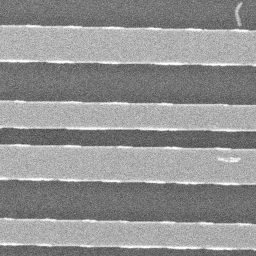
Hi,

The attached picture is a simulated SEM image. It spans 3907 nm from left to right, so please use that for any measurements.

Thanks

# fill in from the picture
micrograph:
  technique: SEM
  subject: lines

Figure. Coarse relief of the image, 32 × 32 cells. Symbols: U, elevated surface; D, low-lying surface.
DDDDDDDDDDDDDDDDDDDDDDDDDDDDDDDD
DDDDDDDDDDDDDDDDDDDDDDDDDDDDDDDD
DDDDDDDDDDDDDDDDDDDDDDDDDDDDDDDD
UUUUUUUUUUUUUUUDDDDDDDDDDDDDDDDD
UUUUUUUUUUUUUUUUUUUUUUUUUUUUUUUU
UUUUUUUUUUUUUUUUUUUUUUUUUUUUUUUU
UUUUUUUUUUUUUUUUUUUUUUUUUUUUUUUU
UUUUUUUUUUUUUUUUUUUUUUUUUUUUUUUU
DDDDDDDDDDDDDDDDDDDDDDDDDDDDDDDD
DDDDDDDDDDDDDDDDDDDDDDDDDDDDDDDD
DDDDDDDDDDDDDDDDDDDDDDDDDDDDDDDD
DDDDDDDDDDDDDDDDDDDDDDDDDDDDDDDD
DDDDDDDDDDDDDDDDDDDDDDDDDDDDDDDD
UUUUUUUUUUUUUUUUUUUUUUUUUUUUUUUU
UUUUUUUUUUUUUUUUUUUUUUUUUUUUUUUU
UUUUUUUUUUUUUUUUUUUUUUUUUUUUUUUU
DDDDDDDDDDDDDDDDDDDDDDDDDDDDDDDD
DDDDDDDDDDDDDDDDDDDDDDDDDDDDDDDD
UUUUUUUUUUUUUUUUDDDDDDDDDDDDDDDD
UUUUUUUUUUUUUUUUUUUUUUUUUUUUUUUU
UUUUUUUUUUUUUUUUUUUUUUUUUUUUUUUU
UUUUUUUUUUUUUUUUUUUUUUUUUUUUUUUU
DDDDDDDDUUUUUUUUUUUUUUUUUUUUUUUU
DDDDDDDDDDDDDDDDDDDDDDDDDDDDDDDD
DDDDDDDDDDDDDDDDDDDDDDDDDDDDDDDD
DDDDDDDDDDDDDDDDDDDDDDDDDDDDDDDD
DDDDDDDDDDDDDDDDDDDDDDDDDDDDDDDD
UUUUUUUDDDDDDDDDDDDDDDDDDDDDDDDD
UUUUUUUUUUUUUUUUUUUUUUUUUUUUUUUU
UUUUUUUUUUUUUUUUUUUUUUUUUUUUUUUU
UUUUUUUUUUUUUUUUUUUUUUUUUUUUUUUU
DDDDDDDDDDDDDDDDDDDDDDDDDDDDDDDD